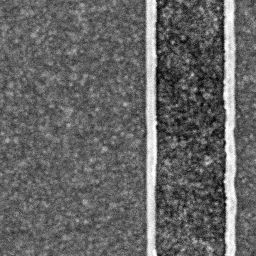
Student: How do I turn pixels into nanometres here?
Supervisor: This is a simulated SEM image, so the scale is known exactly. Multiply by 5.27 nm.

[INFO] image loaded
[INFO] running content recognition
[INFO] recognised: one or a few lines or trenches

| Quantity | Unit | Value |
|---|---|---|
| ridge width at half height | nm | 428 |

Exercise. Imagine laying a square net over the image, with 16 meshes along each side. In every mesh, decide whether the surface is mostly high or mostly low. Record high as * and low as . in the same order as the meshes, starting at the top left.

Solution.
.........*****..
.........*****..
.........*****..
.........*****..
.........*****..
.........*****..
.........*****..
.........*****..
.........*****..
.........*****..
.........******.
.........*****..
.........******.
.........******.
.........*****..
.........*****..